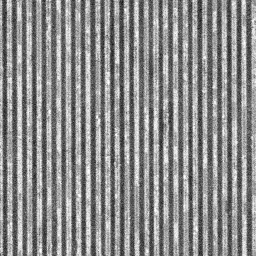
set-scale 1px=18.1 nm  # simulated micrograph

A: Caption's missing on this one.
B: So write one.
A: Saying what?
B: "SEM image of parallel lines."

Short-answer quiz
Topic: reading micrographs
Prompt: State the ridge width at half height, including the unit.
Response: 68 nm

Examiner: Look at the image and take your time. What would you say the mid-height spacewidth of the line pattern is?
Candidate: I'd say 104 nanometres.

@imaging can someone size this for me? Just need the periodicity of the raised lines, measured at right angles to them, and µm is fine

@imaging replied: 0.177